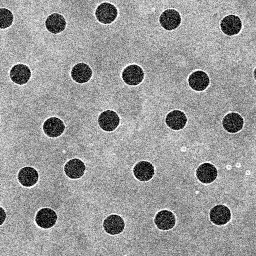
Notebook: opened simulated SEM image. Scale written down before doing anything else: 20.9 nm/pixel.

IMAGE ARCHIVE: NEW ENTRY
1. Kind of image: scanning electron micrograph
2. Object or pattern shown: a regular array of holes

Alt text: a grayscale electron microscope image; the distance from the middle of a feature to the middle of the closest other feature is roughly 51.4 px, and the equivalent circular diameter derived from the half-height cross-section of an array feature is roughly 449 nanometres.